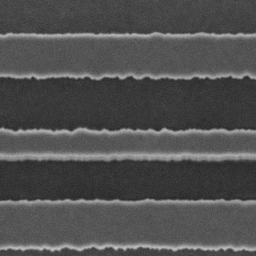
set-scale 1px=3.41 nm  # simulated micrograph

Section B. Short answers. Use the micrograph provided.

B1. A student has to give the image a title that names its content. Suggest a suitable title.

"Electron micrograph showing lines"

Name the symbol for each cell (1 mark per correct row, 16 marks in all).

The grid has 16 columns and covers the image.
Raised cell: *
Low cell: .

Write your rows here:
................
................
****************
****************
****************
................
................
................
****************
****************
................
................
.........*...*..
****************
****************
******.*..******